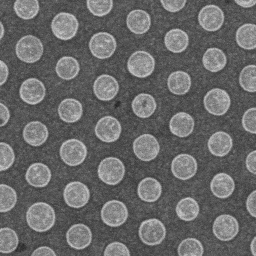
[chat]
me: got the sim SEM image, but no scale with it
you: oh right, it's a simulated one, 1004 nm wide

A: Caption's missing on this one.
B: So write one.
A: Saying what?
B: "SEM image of a regular array of raised bodies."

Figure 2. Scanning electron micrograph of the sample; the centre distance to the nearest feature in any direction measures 41.8 px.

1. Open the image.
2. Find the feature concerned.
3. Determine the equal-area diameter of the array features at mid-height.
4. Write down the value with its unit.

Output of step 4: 96.3 nm